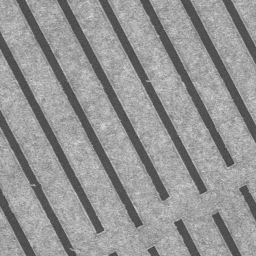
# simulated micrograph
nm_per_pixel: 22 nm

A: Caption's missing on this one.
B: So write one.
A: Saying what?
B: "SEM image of parallel lines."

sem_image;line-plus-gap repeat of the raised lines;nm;802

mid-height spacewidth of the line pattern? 0.202 micrometres